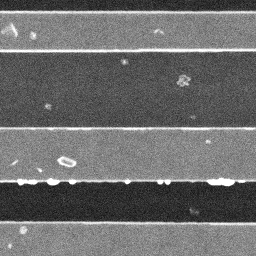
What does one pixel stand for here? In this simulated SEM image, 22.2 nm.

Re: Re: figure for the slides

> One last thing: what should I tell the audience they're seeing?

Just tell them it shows lines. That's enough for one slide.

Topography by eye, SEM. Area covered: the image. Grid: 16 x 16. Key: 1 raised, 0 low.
0000000000000000
1111111111111111
1111111111111111
0000000000000000
0000000000000000
0000000000000000
0000000000000000
0000000000000000
1111111111111111
1111111111111111
1111111111111111
0000000000000100
0000000000000000
0000000000000000
1111111111111111
1111111111111111